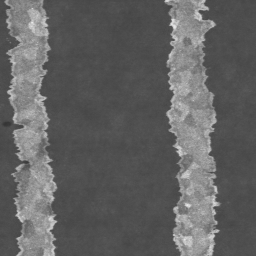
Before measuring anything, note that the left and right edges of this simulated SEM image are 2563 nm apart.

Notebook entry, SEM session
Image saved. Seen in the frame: one or a few lines or trenches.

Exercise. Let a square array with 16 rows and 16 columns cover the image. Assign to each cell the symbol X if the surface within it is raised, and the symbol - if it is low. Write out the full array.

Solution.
-XX--------XX---
-XX--------XX---
-XX--------XX---
-XX--------XX---
-XX--------XX---
-X---------XX---
-XX--------XX---
-XX--------XX---
-XX--------XX---
-XX--------XX---
-XX--------XX---
-XX--------XX---
-XX--------XX---
-XX--------XX---
-XX--------XX---
-XX--------XX---